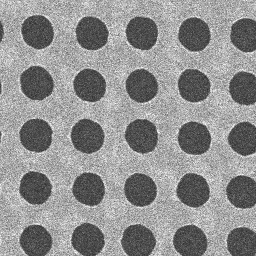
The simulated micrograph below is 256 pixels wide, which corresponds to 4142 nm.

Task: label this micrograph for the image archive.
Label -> a regular array of holes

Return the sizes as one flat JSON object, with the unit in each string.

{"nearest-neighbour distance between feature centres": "826 nanometers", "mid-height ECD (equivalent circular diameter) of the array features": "542 nanometers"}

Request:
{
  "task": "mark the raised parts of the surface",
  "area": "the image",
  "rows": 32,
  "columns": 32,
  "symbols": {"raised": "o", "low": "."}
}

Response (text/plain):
oooooooooooooooooooooooooooooooo
oooooooooooooooooooooooooooooooo
ooo...oooo...ooo...oooo..ooooo..
ooo....ooo...ooo....oo....ooo...
ooo....ooo....oo....oo....ooo...
ooo...oooo...ooo...oooo...ooo...
oooooooooooooooooooooooo.ooooo..
oooooooooooooooooooooooooooooooo
oooo.ooooooooooooooooooooooooooo
ooo...ooo....ooo...ooo....ooo...
ooo....oo....ooo....oo....ooo...
ooo...ooo....ooo....oo....ooo...
oooo.ooooo..ooooo..oooo..oooo...
oooooooooooooooooooooooooooooooo
oooooooooooooooooooooooooooooooo
ooo...ooo...oooo...oooo..ooooo..
oo.....oo....ooo....oo....ooo...
ooo....oo....ooo....oo....ooo...
ooo...ooo....ooo...oooo...ooo...
oooooooooooooooooooooooooooooooo
oooooooooooooooooooooooooooooooo
oooooooooooooooooooooooooooooooo
ooo...ooo....ooo...oooo...ooo...
oo....ooo....ooo....oo....oo....
ooo...ooo....ooo....oo....oo....
oooo.oooooo.oooo...oooo..oooo...
oooooooooooooooooooooooooooooooo
oooooooooooooooooooooooooooooooo
ooo...ooo...oooo..oooo...oooo..o
oo....ooo....oo....ooo....oo....
oo....ooo....oo....ooo....oo....
ooo...oooo..oooo...ooo....ooo...